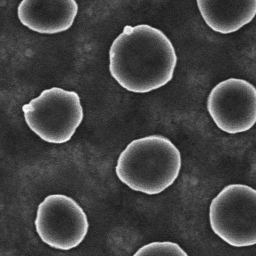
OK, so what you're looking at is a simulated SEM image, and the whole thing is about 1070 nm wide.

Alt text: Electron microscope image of raised bodies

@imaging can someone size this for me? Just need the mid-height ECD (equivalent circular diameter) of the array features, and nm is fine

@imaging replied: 238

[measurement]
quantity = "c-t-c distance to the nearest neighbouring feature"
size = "105 pixels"